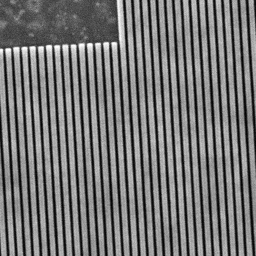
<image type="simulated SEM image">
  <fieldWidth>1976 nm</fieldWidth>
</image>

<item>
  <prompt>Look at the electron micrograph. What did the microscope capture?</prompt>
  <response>parallel lines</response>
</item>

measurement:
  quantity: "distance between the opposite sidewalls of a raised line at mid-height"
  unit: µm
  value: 0.0404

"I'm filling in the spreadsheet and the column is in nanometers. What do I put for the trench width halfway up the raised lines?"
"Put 27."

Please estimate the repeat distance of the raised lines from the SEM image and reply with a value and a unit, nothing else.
0.0631 microns